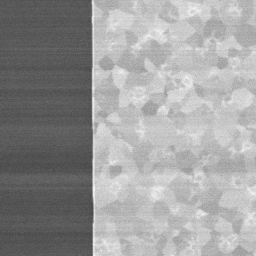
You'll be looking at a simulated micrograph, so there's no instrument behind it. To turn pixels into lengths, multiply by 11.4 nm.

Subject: one or a few lines or trenches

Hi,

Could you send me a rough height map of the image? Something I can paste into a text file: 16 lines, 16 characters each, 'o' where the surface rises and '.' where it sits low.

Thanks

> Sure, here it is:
......oooooooooo
......oooooooooo
......oooooooooo
......oooooooooo
......oooooooooo
......oooooooooo
......oooooooooo
......oooooooooo
......oooooooooo
......oooooooooo
......oooooooooo
......oooooooooo
......oooooooooo
......oooooooooo
......oooooooooo
......oooooooooo